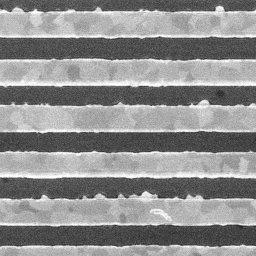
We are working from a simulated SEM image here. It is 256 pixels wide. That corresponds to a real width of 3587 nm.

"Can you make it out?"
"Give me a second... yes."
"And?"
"lines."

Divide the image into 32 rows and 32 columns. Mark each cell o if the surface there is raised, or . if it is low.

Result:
................................
..................o........o....
oooooooooooooooooooooooooooooooo
oooooooooooooooooooooooooooooooo
oooooooooooooooooooooooooooooooo
................................
................................
.........oooo.....o.............
oooooooooooooooooooooooooooooooo
oooooooooooooooooooooooooooooooo
oooooooooooooooooooooooooooooooo
................................
................................
oooooooooooooooooooooooooooooooo
oooooooooooooooooooooooooooooooo
oooooooooooooooooooooooooooooooo
.....o.....o....................
................................
................................
oooooooooooooooooooooooooooooooo
oooooooooooooooooooooooooooooooo
oooooooooooooooooooooooooooooooo
................................
................................
..................o.............
oooooooooooooooooooooooooooooooo
oooooooooooooooooooooooooooooooo
oooooooooooooooooooooooooooooooo
................................
................................
................................
oooooooooooooooooooooooooooooooo